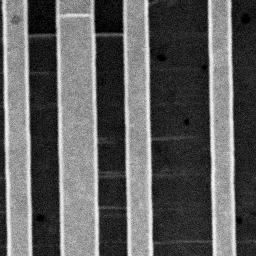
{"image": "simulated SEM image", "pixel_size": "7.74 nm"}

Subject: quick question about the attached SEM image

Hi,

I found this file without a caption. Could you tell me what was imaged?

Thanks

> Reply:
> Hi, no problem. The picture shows wiring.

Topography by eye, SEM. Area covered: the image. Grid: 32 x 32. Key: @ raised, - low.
-@@-------------@@--------@@@---
-@@-------------@@--------@@@---
-@@----@@@@@----@@--------@@@---
-@@----@@@@@----@@--------@@@---
-@@----@@@@@----@@--------@@@---
-@@----@@@@@----@@--------@@@---
-@@----@@@@@----@@--------@@@---
-@@----@@@@@----@@--------@@@---
-@@----@@@@@----@@--------@@@---
-@@----@@@@@----@@--------@@@---
-@@----@@@@@----@@--------@@@---
-@@----@@@@@----@@--------@@@---
-@@----@@@@@----@@--------@@@---
-@@-----@@@@----@@--------@@@---
-@@-----@@@@----@@---------@@---
-@@-----@@@@----@@@--------@@---
-@@@----@@@@----@@@--------@@---
-@@@----@@@@----@@@--------@@---
-@@@----@@@@----@@@--------@@---
-@@@----@@@@----@@@--------@@---
-@@@----@@@@----@@@--------@@---
-@@@----@@@@----@@@--------@@---
-@@@----@@@@----@@@--------@@---
-@@@----@@@@----@@@--------@@---
-@@@----@@@@----@@@--------@@---
-@@@----@@@@----@@@--------@@---
-@@@----@@@@----@@@--------@@---
-@@@----@@@@----@@@--------@@---
-@@@----@@@@----@@@--------@@---
-@@@----@@@@----@@@--------@@---
-@@@----@@@@----@@@--------@@---
-@@@----@@@@----@@@--------@@---